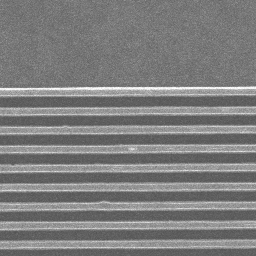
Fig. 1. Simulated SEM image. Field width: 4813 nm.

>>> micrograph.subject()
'parallel lines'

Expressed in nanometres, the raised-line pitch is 358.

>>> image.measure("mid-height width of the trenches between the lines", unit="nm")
219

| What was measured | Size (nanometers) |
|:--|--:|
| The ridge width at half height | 143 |